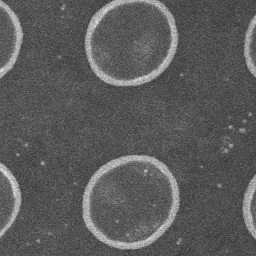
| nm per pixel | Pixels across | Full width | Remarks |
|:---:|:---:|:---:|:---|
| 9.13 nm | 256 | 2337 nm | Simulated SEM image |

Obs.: raised bodies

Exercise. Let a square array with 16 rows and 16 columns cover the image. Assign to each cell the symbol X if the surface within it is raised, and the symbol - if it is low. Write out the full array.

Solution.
-------XXX------
X-----XXXXX-----
X----XXXXXX----X
X-----XXXXX----X
------XXXX------
----------------
----------------
----------------
----------------
----------------
-------XXX------
X-----XXXXX-----
X----XXXXXX----X
X----XXXXXX----X
------XXXX------
----------------